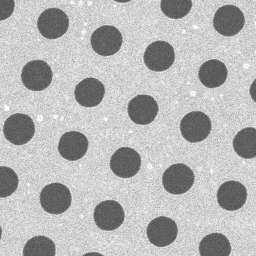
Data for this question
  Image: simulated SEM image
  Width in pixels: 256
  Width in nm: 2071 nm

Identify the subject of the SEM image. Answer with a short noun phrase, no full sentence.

a regular array of holes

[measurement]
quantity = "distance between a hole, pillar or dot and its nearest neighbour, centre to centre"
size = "55.2 px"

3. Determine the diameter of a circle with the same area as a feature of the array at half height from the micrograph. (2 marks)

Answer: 30.8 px